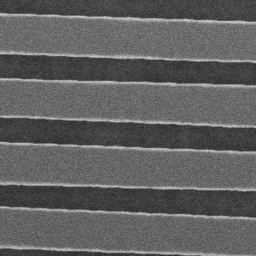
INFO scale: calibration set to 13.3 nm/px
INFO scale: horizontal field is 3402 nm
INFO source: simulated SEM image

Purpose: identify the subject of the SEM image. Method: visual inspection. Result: lines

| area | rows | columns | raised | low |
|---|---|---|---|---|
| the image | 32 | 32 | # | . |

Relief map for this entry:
................................
................................
########################........
################################
################################
################################
################################
.......................#########
................................
................................
######################..........
################################
################################
################################
################################
......................##########
................................
................................
##################..............
################################
################################
################################
################################
...................#############
................................
................................
##############..................
################################
################################
################################
################################
............####################